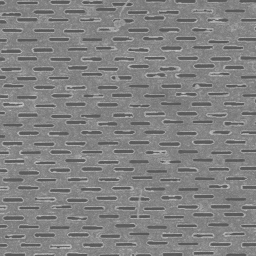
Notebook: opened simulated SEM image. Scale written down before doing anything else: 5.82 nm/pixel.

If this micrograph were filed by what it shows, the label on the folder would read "a regular array of holes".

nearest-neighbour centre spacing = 0.0964 um